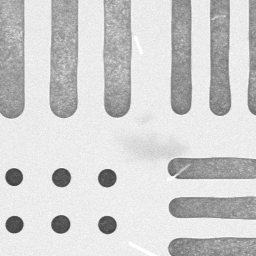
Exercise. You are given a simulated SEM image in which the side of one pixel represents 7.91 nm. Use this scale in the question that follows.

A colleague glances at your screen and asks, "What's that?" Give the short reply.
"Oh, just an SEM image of groups of lines, slits or small figures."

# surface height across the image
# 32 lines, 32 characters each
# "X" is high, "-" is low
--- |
---XXX----XXX---XXXXX---XX---XX-
---XXX----XXX---XXXXX---XX---XX-
---XXX----XXX---XXXXX---XX---XX-
---XXX----XXX---XXXXX---XX---XX-
---XXX----XXX----XXXX---XX---XX-
---XXX----XXX----XXXX---XX---XX-
---XXX----XXX----XXXX---XX---XX-
---XXX----XXX---XXXXX---XX---XX-
---XXX----XXX---XXXXX---XX---XX-
---XXX----XXX---XXXXX---XX---XX-
---XXX----XXX---XXXXX---XX---XX-
---XXX----XXX---XXXXX---XX---XX-
---XXX----XXX---XXXXX---XX---XX-
---XXX----XXX---XXXXX---XX---XX-
--XXXXX--XXXXX-XXXXXXXXXXXX-XXXX
XXXXXXXXXXXXXXXXXXXXXXXXXXXXXXXX
XXXXXXXXXXXXXXXXXXXXXXXXXXXXXXXX
XXXXXXXXXXXXXXXXXXXXXXXXXXXXXXXX
XXXXXXXXXXXXXXXXXXXXXXXXXXXXXXXX
XXXXXXXXXXXXXXXXXXXXXXXXXXXXXXXX
XXXXXXXXXXXXXXXXXXXXX-----------
X--XXXX--XXXX-XXXXXXX-----------
X--XXXX--XXX---XXXXXXXXX-XXXXXXX
XXXXXXXXXXXXXXXXXXXXXXXXXXXXXXXX
XXXXXXXXXXXXXXXXXXXXXXXXXXXXXXX-
XXXXXXXXXXXXXXXXXXXXX-----------
XXXXXXXXXXXXXXXXXXXXX-----------
X--XXXX--XXX--XXXXXXXXXXXXXXXX--
X--XXX---XXX---XXXXXXXXXXXXXXXXX
XXXXXXXXXXXXXXXXXXXXXXXXXXXXXXXX
XXXXXXXXXXXXXXXXXXXXX-----------
XXXXXXXXXXXXXXXXXXXXX-----------